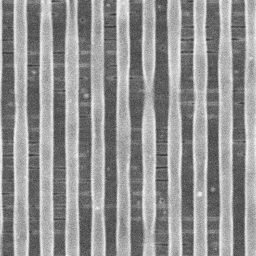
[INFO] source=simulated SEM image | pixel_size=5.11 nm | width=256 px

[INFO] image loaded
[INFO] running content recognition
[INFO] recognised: wiring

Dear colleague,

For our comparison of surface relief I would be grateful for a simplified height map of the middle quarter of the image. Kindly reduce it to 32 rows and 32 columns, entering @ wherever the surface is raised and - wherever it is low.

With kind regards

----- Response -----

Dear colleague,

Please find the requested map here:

@@@----@@@---@@@----@@@---@@@---
@@@----@@@----@@----@@----@@@---
@@@----@@@----@@----@@----@@@---
@@@----@@@----@@----@@----@@@---
-@@----@@@----@@----@@-----@@---
-@@----@@@----@@----@@-----@@---
-@@----@@@---@@@-----@-----@@---
-@@----@@@---@@@-----@-----@@---
-@@----@@@---@@@-----@-----@@---
-@@----@@@---@@@----@@-----@@---
-@@----@@@---@@@----@@----@@@---
-@@----@@@---@@@----@@----@@@---
-@@----@@@---@@@----@@----@@@---
-@@----@@@---@@@----@@@---@@@---
-@@----@@@---@@@----@@@---@@@---
-@@----@@@---@@@----@@@---@@@---
-@@----@@@---@@@----@@@---@@@---
-@@----@@@---@@@----@@@---@@@---
-@@----@@@---@@@----@@@---@@@---
-@@----@@@---@@@----@@@---@@@---
-@@----@@@---@@@----@@@---@@@---
-@@----@@@---@@@----@@@---@@@---
-@@----@@@---@@@----@@@---@@@---
-@@----@@@---@@@----@@@---@@@---
-@@----@@@---@@@----@@@---@@@---
-@@----@@@---@@@----@@@---@@@---
-@@----@@@---@@@----@@@---@@@---
-@@----@@@----@@----@@@---@@@---
-@@----@@@----@@----@@@---@@@---
-@@----@@@----@@----@@@---@@@---
-@@----@@@----@@----@@@---@@@---
-@@----@@@----@@----@@@---@@@---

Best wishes